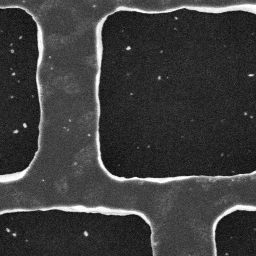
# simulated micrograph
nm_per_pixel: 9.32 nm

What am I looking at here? holes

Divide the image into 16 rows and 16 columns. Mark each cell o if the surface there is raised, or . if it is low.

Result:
oooooooooooooooo
..oooo..........
..oooo..........
..oooo..........
..oooo..........
..oooo..........
...ooo..........
...ooo..........
..oooo..........
..oooo..........
..ooooo.........
oooooooooooooooo
oooooooooooooooo
.........ooooo..
.........oooo...
.........oooo...